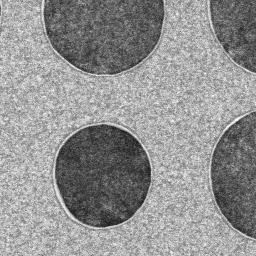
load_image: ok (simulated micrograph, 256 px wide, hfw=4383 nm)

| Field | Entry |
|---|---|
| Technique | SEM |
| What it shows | holes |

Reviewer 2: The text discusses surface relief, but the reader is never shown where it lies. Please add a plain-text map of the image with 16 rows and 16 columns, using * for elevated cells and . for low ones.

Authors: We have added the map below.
***.......***...
***.......***...
***.......****..
****.....*****..
*****...********
****************
****************
***************.
****....******..
****.....****...
***......****...
****.....****...
****.....****...
*****...******..
***************.
****************